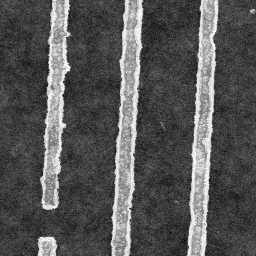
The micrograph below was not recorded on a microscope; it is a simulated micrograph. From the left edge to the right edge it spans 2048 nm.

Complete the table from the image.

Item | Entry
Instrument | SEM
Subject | one or a few lines or trenches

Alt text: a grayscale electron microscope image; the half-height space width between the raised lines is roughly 482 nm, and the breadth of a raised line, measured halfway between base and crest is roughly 113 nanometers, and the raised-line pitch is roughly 598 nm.